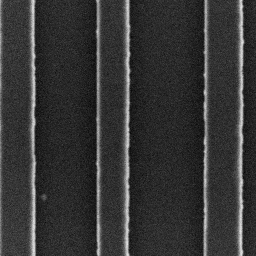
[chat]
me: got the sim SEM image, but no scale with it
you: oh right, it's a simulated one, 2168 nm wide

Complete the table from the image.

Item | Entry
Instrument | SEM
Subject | lines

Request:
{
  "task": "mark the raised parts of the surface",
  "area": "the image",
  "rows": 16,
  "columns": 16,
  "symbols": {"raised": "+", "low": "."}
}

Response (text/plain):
++....++.....++.
++....++.....++.
++....++.....++.
++....++.....++.
++....++.....++.
++....++.....++.
++....++.....++.
++....++.....++.
++....++.....++.
++....++.....++.
++....++.....++.
++....++.....++.
++....++.....++.
++....++.....++.
++....++.....++.
++....++.....++.